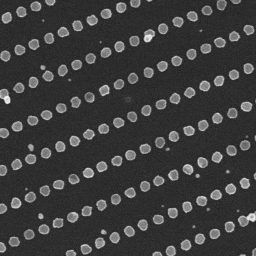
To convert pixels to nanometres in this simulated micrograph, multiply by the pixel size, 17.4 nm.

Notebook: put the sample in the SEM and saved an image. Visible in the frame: a regular array of raised bodies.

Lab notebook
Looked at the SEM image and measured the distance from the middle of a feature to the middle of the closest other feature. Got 268 nanometers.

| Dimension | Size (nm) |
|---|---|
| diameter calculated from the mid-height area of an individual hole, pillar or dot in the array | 174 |